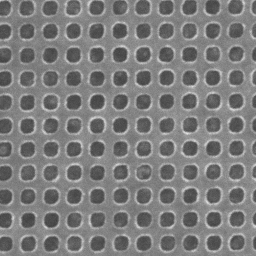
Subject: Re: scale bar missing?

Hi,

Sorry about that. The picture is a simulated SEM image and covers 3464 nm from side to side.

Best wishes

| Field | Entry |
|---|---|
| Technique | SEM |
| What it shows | a regular array of holes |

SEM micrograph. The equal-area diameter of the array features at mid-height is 218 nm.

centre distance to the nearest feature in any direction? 312 nm